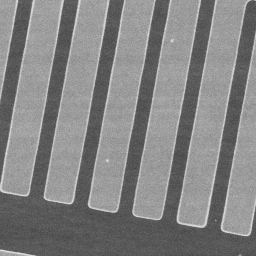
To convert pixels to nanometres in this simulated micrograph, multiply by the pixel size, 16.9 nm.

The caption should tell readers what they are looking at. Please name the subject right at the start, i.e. groups of lines, slits or small figures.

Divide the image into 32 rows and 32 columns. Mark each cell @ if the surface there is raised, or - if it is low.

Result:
@@--@@@@--@@@---@@@--@@@@--@@@@-
@@--@@@@--@@@--@@@@--@@@@--@@@@-
@@--@@@---@@@--@@@@--@@@@--@@@--
@@--@@@--@@@@--@@@@--@@@--@@@@--
@--@@@@--@@@@--@@@@-@@@@--@@@@--
@--@@@@--@@@@--@@@--@@@@--@@@@--
@--@@@@--@@@--@@@@--@@@@--@@@@--
@--@@@@--@@@--@@@@--@@@@--@@@@-@
@--@@@--@@@@--@@@@--@@@@--@@@--@
@-@@@@--@@@@--@@@@--@@@--@@@@--@
--@@@@--@@@@--@@@@-@@@@--@@@@--@
--@@@@--@@@@--@@@--@@@@--@@@@--@
--@@@@--@@@--@@@@--@@@@--@@@@-@@
--@@@@-@@@@--@@@@--@@@@--@@@--@@
--@@@--@@@@--@@@@--@@@--@@@@--@@
-@@@@--@@@@--@@@@--@@@--@@@@--@@
-@@@@--@@@@--@@@--@@@@--@@@@--@@
-@@@@--@@@@-@@@@--@@@@--@@@@--@@
-@@@@--@@@--@@@@--@@@@--@@@@-@@@
-@@@--@@@@--@@@@--@@@@-@@@@--@@@
-@@@--@@@@--@@@@--@@@--@@@@--@@@
@@@@--@@@@--@@@@-@@@@--@@@@--@@@
@@@@--@@@@--@@@--@@@@--@@@@--@@@
@@@@--@@@--@@@@--@@@@--@@@@--@@@
------@@@--@@@@--@@@@--@@@--@@@@
-----------@@@@--@@@@-@@@@--@@@@
-----------------@@@--@@@@--@@@@
----------------------@@@@--@@@@
----------------------------@@@-
--------------------------------
--------------------------------
@@------------------------------